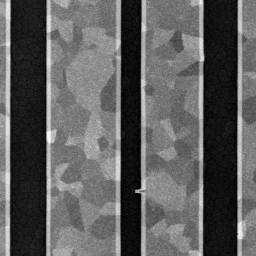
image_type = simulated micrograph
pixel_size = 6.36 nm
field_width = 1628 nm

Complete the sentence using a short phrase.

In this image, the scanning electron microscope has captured one or a few lines or trenches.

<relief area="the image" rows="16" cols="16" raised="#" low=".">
#..####..####..#
#..####..####..#
#..####..####..#
#..####..####..#
#..####..####..#
#..####..####..#
...####..####..#
...####..####..#
...####..####..#
...####..####..#
...####..####..#
...####..####..#
...####..####..#
...####..####..#
...####..####..#
...####..####..#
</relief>